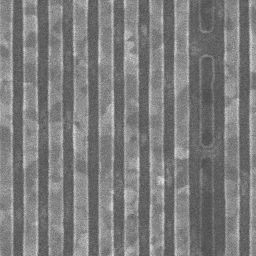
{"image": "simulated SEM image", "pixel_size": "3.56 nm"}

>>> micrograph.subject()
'parallel lines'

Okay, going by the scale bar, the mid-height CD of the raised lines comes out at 45.8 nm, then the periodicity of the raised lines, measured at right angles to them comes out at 89.6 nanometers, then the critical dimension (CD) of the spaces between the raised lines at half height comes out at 42.3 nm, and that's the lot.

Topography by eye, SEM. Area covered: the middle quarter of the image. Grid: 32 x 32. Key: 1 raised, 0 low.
00011100011100011100001110001110
00011100011100011100001110001110
00011100011100011110001110001110
00011100011100011110001110001110
00011100011100011100011110001110
00011100011100011110011110001110
00011100011100011110011110001110
00011100011100011110011100001110
00011100011100011110011100001110
00011100011100011110011110001110
00011100011100011110011110001110
00011100011100011110011110001110
00011100011100011110011110001110
00011100011100011110011110001110
00011100011100011110011110001110
00011100011100011110011110001110
00011100011100011110011110001110
00011100011100011110001110001110
00011100011100011110001100001110
00011100011100011110001100001110
00011100011100011110001100001110
00011100011100011110001100001110
00011100011100011110001110001110
00011000011100011110001110001110
00011000011100011110001110001110
00011000011100011110001110001110
00011100011100011110001110001110
00011100011100011110001110001110
00011100011100011110001110001110
00011100011100011110001110001110
00011100011100011110001110001110
00011100011100011110001110001110